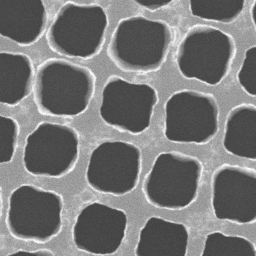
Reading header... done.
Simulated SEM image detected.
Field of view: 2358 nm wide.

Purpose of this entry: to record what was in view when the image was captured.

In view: a regular array of holes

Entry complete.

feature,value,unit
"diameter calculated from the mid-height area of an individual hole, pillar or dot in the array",492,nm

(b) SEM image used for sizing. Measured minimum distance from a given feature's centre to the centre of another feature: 63.4 pixels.